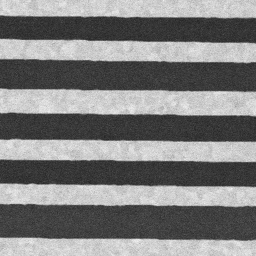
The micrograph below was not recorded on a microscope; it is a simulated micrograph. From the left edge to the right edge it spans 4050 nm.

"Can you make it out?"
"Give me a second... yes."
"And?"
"lines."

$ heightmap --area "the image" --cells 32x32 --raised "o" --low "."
oooooooooooooooooooooooooooooooo
oooooooooooooooooooooooooooooooo
................................
................................
................................
oooooooooooooooooooooooooooooooo
oooooooooooooooooooooooooooooooo
...........ooooooooooooooooooooo
................................
................................
................................
oooooooooooooooooooooooooooooo..
oooooooooooooooooooooooooooooooo
oooooooooooooooooooooooooooooooo
................................
................................
................................
................................
oooooooooooooooooooooooooooooooo
oooooooooooooooooooooooooooooooo
................................
................................
................................
ooooooooooooooooooooooooooooooo.
oooooooooooooooooooooooooooooooo
.....ooooooooooooooooooooooooooo
................................
................................
................................
................................
oooooooooooooooooooooooooooooooo
oooooooooooooooooooooooooooooooo